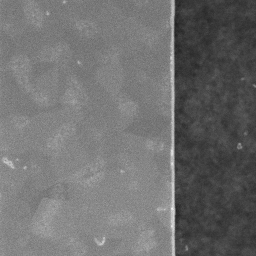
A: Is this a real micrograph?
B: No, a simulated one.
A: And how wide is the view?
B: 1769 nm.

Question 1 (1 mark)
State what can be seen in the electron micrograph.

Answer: one or a few lines or trenches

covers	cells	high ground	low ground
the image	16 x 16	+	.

+++++++++++.....
+++++++++++.....
+++++++++++.....
+++++++++++.....
+++++++++++.....
+++++++++++.....
+++++++++++.....
+++++++++++.....
+++++++++++.....
+++++++++++.....
+++++++++++.....
+++++++++++.....
+++++++++++.....
+++++++++++.....
+++++++++++.....
+++++++++++.....